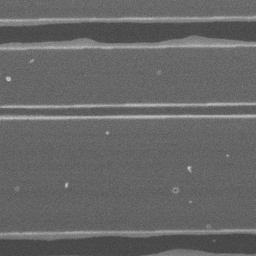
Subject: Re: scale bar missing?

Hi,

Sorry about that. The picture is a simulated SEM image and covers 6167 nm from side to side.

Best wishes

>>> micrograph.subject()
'lines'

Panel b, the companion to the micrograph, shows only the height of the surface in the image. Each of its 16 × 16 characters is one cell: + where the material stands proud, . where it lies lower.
++++++++++++++++
................
................
++++++++++++++++
++++++++++++++++
++++++++++++++++
++++++++++++++++
++++++++++++++++
++++++++++++++++
++++++++++++++++
++++++++++++++++
++++++++++++++++
++++++++++++++++
++++++++++++++++
++++++++++++++..
................